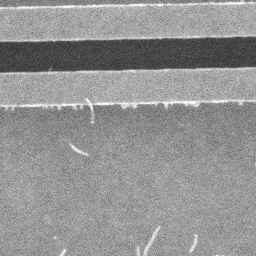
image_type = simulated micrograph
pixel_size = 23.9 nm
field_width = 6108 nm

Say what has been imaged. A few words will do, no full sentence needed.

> lines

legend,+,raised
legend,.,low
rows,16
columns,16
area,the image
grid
.+++++++++++++++
++++++++++++++++
++++++..........
................
....++++++++++++
++++++++++++++++
+++++++.........
................
................
................
................
................
................
................
................
................